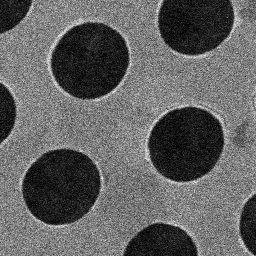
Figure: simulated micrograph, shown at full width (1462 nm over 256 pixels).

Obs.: holes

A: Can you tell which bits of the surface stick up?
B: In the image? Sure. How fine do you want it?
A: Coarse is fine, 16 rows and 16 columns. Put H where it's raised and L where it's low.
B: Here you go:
LLHHHHHHHHLLLLLH
LHHHHLHHHHLLLLLH
HHHHLLLLHHLLLLHH
HHHLLLLLHHHHHHHH
HHHLLLLLHHHHHHHH
HHHHLLLHHHHHHHHH
LHHHHHHHHHHHHHHH
LHHHHHHHHHLLLLHH
LHHHHHHHHLLLLLHH
HHHLLHHHHLLLLLHH
HHLLLLHHHHLLLHHH
HLLLLLHHHHHHHHHH
HLLLLLHHHHHHHHHH
HHLLLHHHHHHHHHHL
HHHHHHHHHLLLHHHL
HHHHHHHHLLLLHHHL